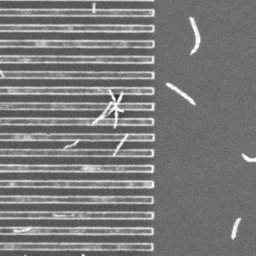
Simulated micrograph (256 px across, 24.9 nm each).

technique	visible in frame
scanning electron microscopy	parallel lines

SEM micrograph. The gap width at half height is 228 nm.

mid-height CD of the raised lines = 159 nanometres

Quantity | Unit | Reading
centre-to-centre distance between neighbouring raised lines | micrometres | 0.389